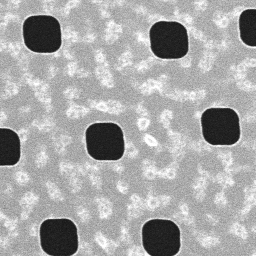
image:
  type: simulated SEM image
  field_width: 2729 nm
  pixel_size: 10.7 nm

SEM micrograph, holes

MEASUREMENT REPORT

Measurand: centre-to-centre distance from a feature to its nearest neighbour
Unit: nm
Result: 1160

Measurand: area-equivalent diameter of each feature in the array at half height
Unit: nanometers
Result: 433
